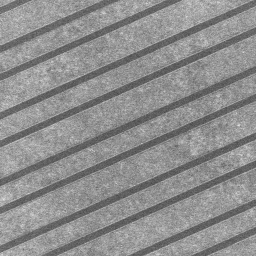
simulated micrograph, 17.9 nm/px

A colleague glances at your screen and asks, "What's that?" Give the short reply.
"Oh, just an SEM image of parallel lines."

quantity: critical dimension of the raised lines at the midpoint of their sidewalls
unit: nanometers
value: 133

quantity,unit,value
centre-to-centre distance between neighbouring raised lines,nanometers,541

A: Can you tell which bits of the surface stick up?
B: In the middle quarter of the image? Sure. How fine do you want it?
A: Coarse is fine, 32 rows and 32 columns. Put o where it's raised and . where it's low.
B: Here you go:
..........oooo............oooo..
........oooo...........ooooo....
......oooo...........ooooo......
...ooooo...........ooooo........
.oooo............oooo...........
ooo...........ooooo.............
o...........ooooo...............
..........ooooo.................
........oooo..................oo
.....ooooo.................ooooo
...ooooo.................oooo...
.ooooo.................oooo.....
ooo..................oooo.......
o.................ooooo.........
................ooooo...........
..............oooo............oo
...........ooooo...........ooooo
.........ooooo...........ooooo..
.......oooo............oooo.....
.....oooo............oooo.......
..ooooo...........ooooo.........
ooooo...........ooooo...........
ooo...........oooo..............
............oooo................
.........ooooo.................o
.......oooo..................ooo
.....oooo..................oooo.
...oooo.................ooooo...
ooooo.................oooo......
oo..................oooo........
.................ooooo..........
...............ooooo...........o